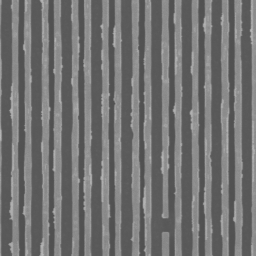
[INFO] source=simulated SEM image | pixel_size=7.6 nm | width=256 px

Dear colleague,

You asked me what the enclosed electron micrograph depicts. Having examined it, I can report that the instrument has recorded parallel lines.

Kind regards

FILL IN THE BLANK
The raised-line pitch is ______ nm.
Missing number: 113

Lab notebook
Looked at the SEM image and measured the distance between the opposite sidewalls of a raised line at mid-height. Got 57 nanometres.